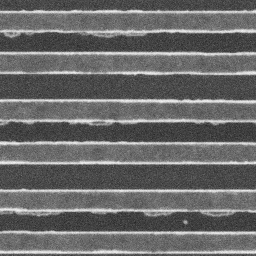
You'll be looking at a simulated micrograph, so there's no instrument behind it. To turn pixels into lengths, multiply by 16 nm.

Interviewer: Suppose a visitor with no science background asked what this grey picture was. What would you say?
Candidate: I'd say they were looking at lines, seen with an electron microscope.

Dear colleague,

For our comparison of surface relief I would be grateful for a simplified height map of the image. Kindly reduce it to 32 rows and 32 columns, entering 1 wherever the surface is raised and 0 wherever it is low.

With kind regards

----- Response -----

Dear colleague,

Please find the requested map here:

00000000000000000000000000000000
11111111111111111111111111111111
11111111111111111111111111111111
11111111111111111111111111111111
00000000000000000000000000000000
00000000000000000000000000000000
00000000000000000000000000000000
11111111111111111111111111111111
11111111111111111111111111111111
00000000000000000000000000000000
00000000000000000000000000000000
00000000000000000000000000000000
00000000000000000000000000000000
11111111111111111111111111111111
11111111111111111111111111111111
00000000000000000000000000000000
00000000000000000000000000000000
00000000000000000000000000000000
11111111111111111111111111111111
11111111111111111111111111111111
00000000000000000000000000000000
00000000000000000000000000000000
00000000000000000000000000000000
00000000000000000000000000000000
11111111111111111111111111111111
11111111111111111111111111111111
00000000000000000000000000000000
00000000000000000000000000000000
00000000000000000000000000000000
11111111111111111111111111111111
11111111111111111111111111111111
11111111111111111111111111111111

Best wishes